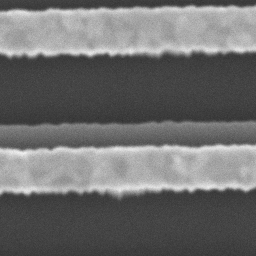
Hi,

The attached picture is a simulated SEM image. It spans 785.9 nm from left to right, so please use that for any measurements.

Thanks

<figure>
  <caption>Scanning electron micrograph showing lines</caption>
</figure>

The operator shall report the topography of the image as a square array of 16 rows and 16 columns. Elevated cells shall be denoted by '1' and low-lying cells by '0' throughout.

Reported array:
1111111111111111
1111111111111111
1111111111111111
0000000000000000
0000000000000000
0000000000000000
0000000000000000
0000000000000000
1111111111111111
1111111111111111
1111111111111111
1111111111111111
0000000000000000
0000000000000000
0000000000000000
0000000000000000